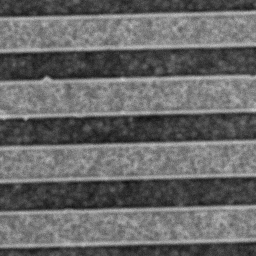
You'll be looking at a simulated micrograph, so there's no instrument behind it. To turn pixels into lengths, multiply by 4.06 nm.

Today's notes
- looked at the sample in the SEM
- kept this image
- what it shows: one or a few lines or trenches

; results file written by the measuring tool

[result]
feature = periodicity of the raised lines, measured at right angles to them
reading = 264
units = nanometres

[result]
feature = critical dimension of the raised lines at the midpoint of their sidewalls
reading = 131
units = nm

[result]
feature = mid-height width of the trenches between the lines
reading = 131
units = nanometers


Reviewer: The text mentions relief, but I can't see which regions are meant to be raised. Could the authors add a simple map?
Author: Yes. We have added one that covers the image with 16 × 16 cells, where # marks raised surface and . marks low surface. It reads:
................
################
################
................
................
################
################
................
................
################
################
................
................
################
################
................